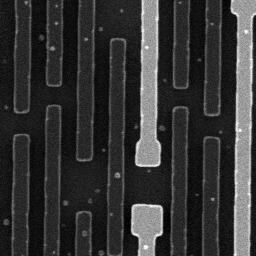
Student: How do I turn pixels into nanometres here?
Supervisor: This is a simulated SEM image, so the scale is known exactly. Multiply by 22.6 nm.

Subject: wiring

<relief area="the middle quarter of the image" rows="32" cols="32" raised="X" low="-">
----XXX----XXXX----XXXX----XXXX-
---XXXX----XXXX----XXXX----XXXX-
---XXXX----XXXX----XXXX----XXXX-
---XXXX----XXXX----XXXX----XXXX-
---XXXX----XXXX----XXXX----XXXX-
---XXXX----XXXX----XXXX----XXXX-
---XXXX----XXXX----XXXX---------
---XXXX----XXXX----XXXX---------
---XXXX----XXXX----XXXX---------
---XXXX----XXXX----XXXX---------
---XXXX----XXXX----XXXX---------
---XXXX----XXXX----XXXX----XXXX-
---XXXX----XXXX----XXXX----XXXX-
---XXXX----XXXX----XXXX----XXXX-
---XXXX----XXXX----XXXX----XXXX-
---XXXX----XXXX----XXXX----XXXX-
---XXXX----XXXX----XXXX----XXXX-
---XXXX----XXXX----XXXX----XXXX-
---XXXX----XXXX----XXXX----XXXX-
---XXXX----XXXX----XXXX----XXXX-
---XXXX----XXXX---XXXXXX---XXXX-
---XXXX----XXXX---XXXXXX---XXXX-
---XXXX----XXXX---XXXXXX---XXXX-
---XXXX----XXXX---XXXXXX---XXXX-
-----------XXXX---XXXXXX---XXXX-
-----------XXXX------------XXXX-
-----------XXXX------------XXXX-
-----------XXXX------------XXXX-
-----------XXXX------------XXXX-
-----------XXXX------------XXXX-
-----------XXXX------------XXXX-
-----------XXXX------------XXXX-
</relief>